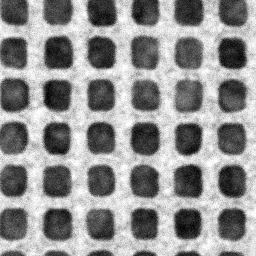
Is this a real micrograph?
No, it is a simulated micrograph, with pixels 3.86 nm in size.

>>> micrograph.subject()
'a regular array of holes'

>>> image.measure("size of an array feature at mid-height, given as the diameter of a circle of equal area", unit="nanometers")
135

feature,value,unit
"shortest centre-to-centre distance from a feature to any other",164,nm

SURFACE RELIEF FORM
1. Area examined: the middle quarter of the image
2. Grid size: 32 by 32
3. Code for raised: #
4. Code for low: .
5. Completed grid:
..####.......####.......####....
.#######.#########.....######..#
################################
########...#######.###########..
..####......#####......#####....
..####.......####.......###.....
..####.......###........###.....
..####.......####.......###.....
..####.......####.......###.....
..####.......####.......###.....
..####.......####.......###.....
.#####......######.....#####....
##############################.#
################################
.######....#######.....########.
..####......#####.......####....
..####.......####.......###.....
..###........####.......###.....
..###........####.......###.....
..###........###........###.....
..####.......####.......###.....
..####.......####.......####....
.######.....######.....#####....
################################
################################
.#####......#####.....#######...
..####.......####......####.....
..###........###........###.....
..###........###........###.....
..###........###........###.....
..####.......###........###.....
..####.......###........###.....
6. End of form